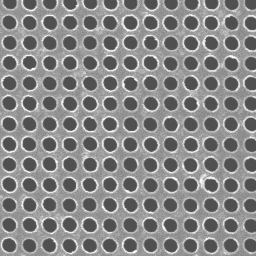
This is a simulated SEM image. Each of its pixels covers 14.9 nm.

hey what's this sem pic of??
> a regular array of holes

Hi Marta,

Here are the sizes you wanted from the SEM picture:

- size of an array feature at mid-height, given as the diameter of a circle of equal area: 200 nm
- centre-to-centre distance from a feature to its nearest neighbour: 298 nanometers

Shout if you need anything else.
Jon